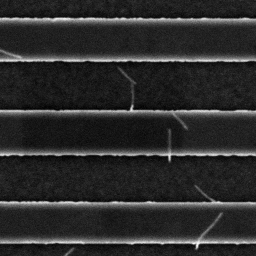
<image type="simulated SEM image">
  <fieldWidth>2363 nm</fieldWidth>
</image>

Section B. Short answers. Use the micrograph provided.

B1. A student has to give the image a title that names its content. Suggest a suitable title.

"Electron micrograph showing lines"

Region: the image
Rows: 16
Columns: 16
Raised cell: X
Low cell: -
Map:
----------------
XXXXXXXXXXXXXXXX
XXXXXXXXXXXXXXXX
XXXXXXXXXXXXXXXX
----------------
----------------
----------------
XXXXXXXXXXXXXXXX
XXXXXXXXXXXXXXXX
XXXXXXXXXXXXXXXX
----------------
----------------
----------------
XXXXXXXXXXXXXXXX
XXXXXXXXXXXXXXXX
----------------